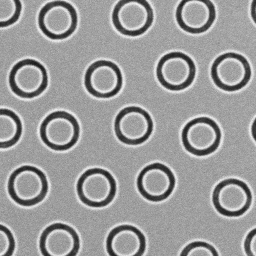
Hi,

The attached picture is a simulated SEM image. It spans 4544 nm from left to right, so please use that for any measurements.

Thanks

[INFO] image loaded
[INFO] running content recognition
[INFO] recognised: a regular array of ring-shaped grooves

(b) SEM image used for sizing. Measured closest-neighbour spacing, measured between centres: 1080 nanometers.